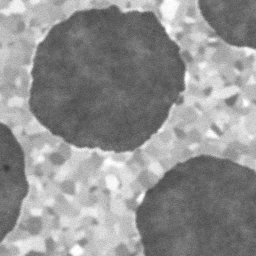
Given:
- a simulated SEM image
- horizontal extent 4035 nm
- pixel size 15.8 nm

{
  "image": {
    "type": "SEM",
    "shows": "holes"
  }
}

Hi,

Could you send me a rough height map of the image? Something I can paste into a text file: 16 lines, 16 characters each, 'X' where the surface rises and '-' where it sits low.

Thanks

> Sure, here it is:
XXXXXX-XXXXX----
XXX-------XXX---
XXX--------XXX--
XX---------XXXXX
XX----------XXXX
XX----------XXXX
XX---------XXXXX
XX--------XXXXXX
-XXX------XXXXXX
-XXXXXX-XXXXXXXX
--XXXXXXXXX-----
--XXXXXXXX------
--XXXXXXX-------
-XXXXXXX--------
-XXXXXXXX-------
XXXXXXXXX-------